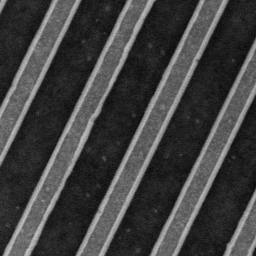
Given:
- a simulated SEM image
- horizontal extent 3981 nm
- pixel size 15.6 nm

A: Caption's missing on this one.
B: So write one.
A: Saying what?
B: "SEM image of one or a few lines or trenches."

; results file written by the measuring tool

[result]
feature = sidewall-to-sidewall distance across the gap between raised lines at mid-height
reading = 706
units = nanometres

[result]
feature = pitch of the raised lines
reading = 66.2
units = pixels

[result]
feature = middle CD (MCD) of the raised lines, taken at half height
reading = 20.9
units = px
